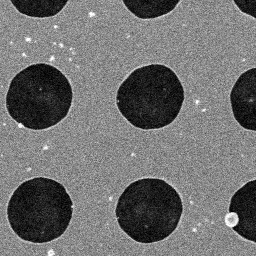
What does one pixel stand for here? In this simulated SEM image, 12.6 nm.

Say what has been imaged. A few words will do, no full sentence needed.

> holes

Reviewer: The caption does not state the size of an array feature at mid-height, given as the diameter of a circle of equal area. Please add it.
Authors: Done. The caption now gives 823 nm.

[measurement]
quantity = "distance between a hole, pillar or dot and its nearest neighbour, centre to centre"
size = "1390 nanometres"